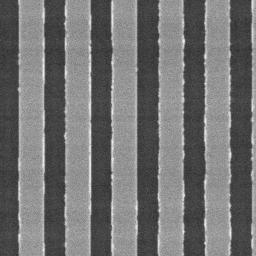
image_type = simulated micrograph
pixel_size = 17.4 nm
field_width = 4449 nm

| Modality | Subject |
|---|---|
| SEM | lines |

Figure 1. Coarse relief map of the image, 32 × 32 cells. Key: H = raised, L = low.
LLHHHLLLHHHLLLHHHLLLHHHLLLHHHLLL
LLHHHLLLHHHLLLHHHLLLHHHLLLHHHLLL
LLHHHLLLHHHLLLHHHLLLHHHLLLHHHLLL
LLHHHLLLHHHLLLHHHLLLHHHLLLHHHLLL
LLHHHLLLHHHLLLHHHLLLHHHLLLHHHLLL
LLHHHLLLHHHLLLHHHLLLHHHLLLHHHLLL
LLHHHLLLHHHLLLHHHLLLHHHLLLHHHLLL
LLHHHLLLHHHLLLHHHLLLHHHLLLHHHLLL
LLHHHLLLHHHLLLHHHLLLHHHLLLHHHLLL
LLHHHLLLHHHLLLHHHLLLHHHLLLHHHLLL
LLHHHLLLHHHLLLHHHLLLHHHLLLHHHLLL
LLHHHLLLHHHLLLHHHLLLHHHLLLHHHLLL
LLHHHLLLHHHLLLHHHLLLHHHLLLHHHLLL
LLHHHLLLHHHLLLHHHLLLHHHLLLHHHLLL
LLHHHLLLHHHLLLHHHLLLHHHLLLHHHLLL
LLHHHLLLHHHLLLHHHLLLHHHLLLHHHLLL
LLHHHLLLHHHLLLHHHLLLHHHLLLHHHLLL
LLHHHLLLHHHLLLHHHLLLHHHLLLHHHLLL
LLHHHLLLHHHLLLHHHLLLHHHLLLHHHLLL
LLHHHLLLHHHLLLHHHLLLHHHLLLHHHLLL
LLHHHLLLHHHLLLHHHLLLHHHLLLHHHLLL
LLHHHLLLHHHLLLHHHLLLHHHLLLHHHLLL
LLHHHLLLHHHLLLHHHLLLHHHLLLHHHLLL
LLHHHLLLHHHLLLHHHLLLHHHLLLHHHLLL
LLHHHLLLHHHLLLHHHLLLHHHLLLHHHLLL
LLHHHLLLHHHLLLHHHLLLHHHLLLHHHLLL
LLHHHLLLHHHLLLHHHLLLHHHLLLHHHLLL
LLHHHLLLHHHLLLHHHLLLHHHLLLHHHLLL
LLHHHLLLHHHLLLHHHLLLHHHLLLHHHLLL
LLHHHLLLHHHLLLHHHLLLHHHLLLHHHLLL
LLHHHLLLHHHLLLHHHLLLHHHLLLHHHLLL
LLHHHLLLHHHLLLHHHLLLHHHLLLHHHLLL